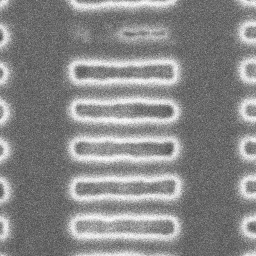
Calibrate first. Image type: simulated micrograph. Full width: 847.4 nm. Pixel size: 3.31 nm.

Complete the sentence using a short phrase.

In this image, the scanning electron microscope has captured holes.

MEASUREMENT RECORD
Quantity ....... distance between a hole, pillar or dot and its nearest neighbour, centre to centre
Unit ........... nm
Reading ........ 128